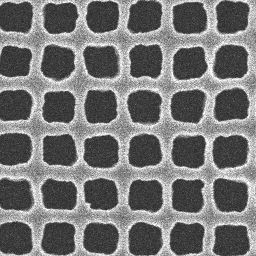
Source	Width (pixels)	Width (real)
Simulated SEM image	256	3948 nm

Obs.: a regular array of holes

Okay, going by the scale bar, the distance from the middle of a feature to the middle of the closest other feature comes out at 648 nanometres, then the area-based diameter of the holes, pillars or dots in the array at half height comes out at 546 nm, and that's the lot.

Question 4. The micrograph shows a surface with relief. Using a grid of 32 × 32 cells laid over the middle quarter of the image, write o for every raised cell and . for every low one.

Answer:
...oo.........ooo........oo.....
...ooo........ooo.......ooo.....
..oooo........ooo.......ooo.....
.ooooooo....oooooooooo.ooooo....
oooooooooooooooooooooooooooooooo
oooooooooooooooooooooooooooooooo
oooooo.oooooooooooo..oooooooooo.
..oooo.......ooo........oooo....
...oo........ooo........ooo.....
...oo........ooo.........oo.....
...oo........ooo........ooo.....
...oo........ooo........ooo.....
...oo.........oo........ooo.....
..ooo........oooo.......ooo.....
..oooo......ooooo......oooooo...
oooooooooooooooooooooooooooooooo
oooooooooooooooooooooooooooooooo
.oooooooooooooooooo..ooooooooooo
..oooo.......oooo......ooooo....
...oo........ooo........ooo.....
...oo.........oo........ooo.....
...oo.........oo........ooo.....
...oo.........oo........ooo.....
...oo.........oo.........oo.....
...oo........ooo........ooo.....
..oooo.......oooo.....oooooo....
oooooooooooooooooooooooooooooooo
oooooooooooooooooooooooooooooooo
ooooooooo.oooooooooooooooooooooo
..ooo........oooo.......ooo.....
...oo........ooo........ooo.....
...oo........ooo.........oo.....